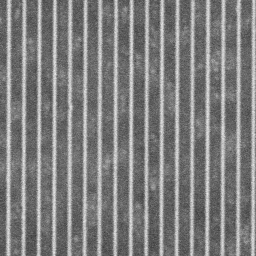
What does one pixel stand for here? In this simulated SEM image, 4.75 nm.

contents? parallel lines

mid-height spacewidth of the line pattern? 60 nanometres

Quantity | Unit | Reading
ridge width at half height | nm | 11.9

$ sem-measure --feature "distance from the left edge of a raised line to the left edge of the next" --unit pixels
15.3